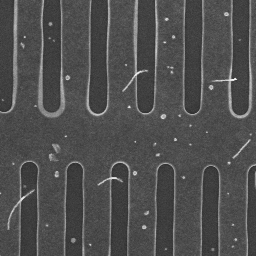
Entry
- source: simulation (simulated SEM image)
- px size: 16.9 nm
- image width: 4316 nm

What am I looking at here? groups of lines, slits or small figures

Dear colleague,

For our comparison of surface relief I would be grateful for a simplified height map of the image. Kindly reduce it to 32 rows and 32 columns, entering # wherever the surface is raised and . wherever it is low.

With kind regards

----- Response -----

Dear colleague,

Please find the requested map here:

..###...###...###...###..####..#
..###...###...###...###..####..#
..###...###...###...###..####..#
..###...###...###...###..####..#
..###...###...###...###..####..#
..###...###...###...###..####..#
..###...###..####...###..####..#
..###...###..####...###..####..#
..###...###..####..####..####..#
..###...###...###..####..####..#
..###...###...###..####..####..#
..###...###...###..####..####..#
..###...###...###..####..####..#
.####...###..####..####..####..#
################################
################################
################################
################################
################################
################################
###.#####.#####.################
###..###..####..####..###..####.
###..###..####..####..###..####.
###..###..####..####..###..####.
###..###..####..###...###..####.
###..###..####..####..###..####.
##...###..####..####..###..####.
##...###..####..####..###..####.
##...###..####..###...###..####.
##...###..####..###...###..####.
##...###..####..###...###..####.
##...###..####..###...###..####.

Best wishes